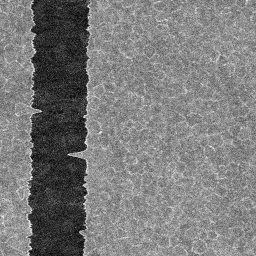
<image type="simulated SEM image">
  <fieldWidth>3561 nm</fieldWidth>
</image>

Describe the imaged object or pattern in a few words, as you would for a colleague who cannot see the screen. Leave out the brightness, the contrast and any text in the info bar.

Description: one or a few lines or trenches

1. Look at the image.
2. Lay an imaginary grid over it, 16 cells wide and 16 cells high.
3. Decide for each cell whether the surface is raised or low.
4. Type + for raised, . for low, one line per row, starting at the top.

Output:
++....++++++++++
++....++++++++++
++....++++++++++
++...+++++++++++
++...+++++++++++
++...+++++++++++
++...+++++++++++
++...+++++++++++
++...+++++++++++
++...+++++++++++
++...+++++++++++
++...+++++++++++
++...+++++++++++
++...+++++++++++
++...+++++++++++
++...+++++++++++